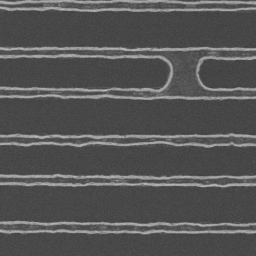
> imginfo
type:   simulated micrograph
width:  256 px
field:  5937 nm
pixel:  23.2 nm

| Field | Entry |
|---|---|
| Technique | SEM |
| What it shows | parallel lines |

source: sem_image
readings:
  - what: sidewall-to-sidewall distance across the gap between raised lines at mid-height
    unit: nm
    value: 887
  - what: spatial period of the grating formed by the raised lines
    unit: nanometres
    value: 1030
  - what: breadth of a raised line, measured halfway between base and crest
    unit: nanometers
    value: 194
